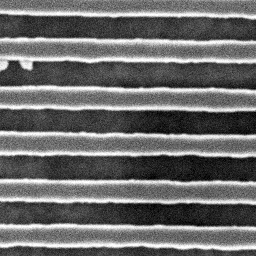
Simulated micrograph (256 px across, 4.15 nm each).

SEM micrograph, lines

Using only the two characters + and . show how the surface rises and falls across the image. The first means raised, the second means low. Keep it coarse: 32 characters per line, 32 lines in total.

++++++++++++++++++++++++++++++++
++++++++++++++++++++++++++++++++
................................
................................
................................
++++++++++++++++++++++++++++++++
++++++++++++++++++++++++++++++++
+.++++++.+++++++++++++++++++++++
................................
................................
................................
++++++++++++++++++++++++++++++++
++++++++++++++++++++++++++++++++
.++.+..+++++++++++++++++++++++++
................................
................................
................................
++++++++++++++++++++++++++++++++
++++++++++++++++++++++++++++++++
.............................++.
................................
................................
................................
++++++++++++++++++++++++++++++++
++++++++++++++++++++++++++++++++
................................
................................
................................
++++++++++++++++++++++++++++++++
++++++++++++++++++++++++++++++++
++++++++++++++++++++++++++++++++
................................